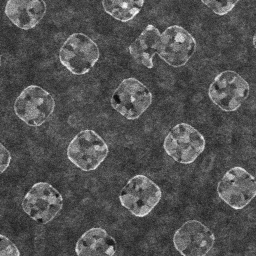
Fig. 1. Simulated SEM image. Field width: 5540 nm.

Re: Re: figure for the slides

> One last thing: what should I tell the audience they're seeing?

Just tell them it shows a regular array of raised bodies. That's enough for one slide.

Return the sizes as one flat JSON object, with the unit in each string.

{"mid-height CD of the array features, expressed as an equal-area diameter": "38.1 px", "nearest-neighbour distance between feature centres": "1480 nm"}